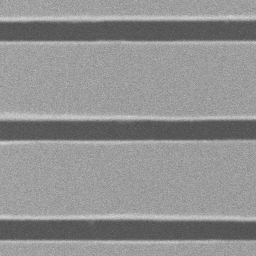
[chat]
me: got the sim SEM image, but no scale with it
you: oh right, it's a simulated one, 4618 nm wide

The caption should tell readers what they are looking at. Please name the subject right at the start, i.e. lines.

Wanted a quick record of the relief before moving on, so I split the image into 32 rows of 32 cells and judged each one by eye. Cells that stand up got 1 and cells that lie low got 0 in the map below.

11111111111111111111111111111111
11111111111111111111111111111111
11111111111111111111111111000000
00000000000000000000000000000000
00000000000000000000000000000000
11111111111111111111111111111111
11111111111111111111111111111111
11111111111111111111111111111111
11111111111111111111111111111111
11111111111111111111111111111111
11111111111111111111111111111111
11111111111111111111111111111111
11111111111111111111111111111111
11111111111111111111111111111111
11111111111111111111111111111111
00000000000000000000000000000000
00000000000000000000000000000000
00000000000000000000000000000000
11111111111111111111111111111111
11111111111111111111111111111111
11111111111111111111111111111111
11111111111111111111111111111111
11111111111111111111111111111111
11111111111111111111111111111111
11111111111111111111111111111111
11111111111111111111111111111111
11111111111111111111111111111111
00000000000000000000000001111111
00000000000000000000000000000000
00000000000000000000000000000000
11111111111111111111111111111111
11111111111111111111111111111111